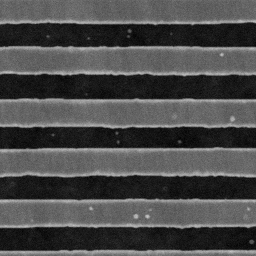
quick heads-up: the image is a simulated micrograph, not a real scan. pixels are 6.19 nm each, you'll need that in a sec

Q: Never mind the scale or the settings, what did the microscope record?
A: lines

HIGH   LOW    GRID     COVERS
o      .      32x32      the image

oooooooooooooooooooooooooooooooo
oooooooooooooooooooooooooooooooo
oooooooooooooooooooooooooooooooo
................................
................................
................................
oooooooooooooooooooooooooooooooo
oooooooooooooooooooooooooooooooo
oooooooooooooooooooooooooooooooo
................................
................................
................................
oooooooooooooooooooooooooooooooo
oooooooooooooooooooooooooooooooo
oooooooooooooooooooooooooooooooo
oooooooooooooooooooooooooooooooo
................................
................................
..........................oo....
oooooooooooooooooooooooooooooooo
oooooooooooooooooooooooooooooooo
oooooooooooooooooooooooooooooooo
................................
................................
................................
oooooooooooooooooooooooooooooooo
oooooooooooooooooooooooooooooooo
oooooooooooooooooooooooooooooooo
......................o.........
................................
................................
oooooooooooooooooooooooooooooooo